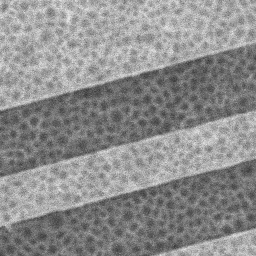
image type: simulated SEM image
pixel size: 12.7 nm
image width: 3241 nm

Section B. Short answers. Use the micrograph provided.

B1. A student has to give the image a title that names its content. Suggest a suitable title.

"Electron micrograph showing one or a few lines or trenches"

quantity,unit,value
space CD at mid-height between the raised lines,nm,850